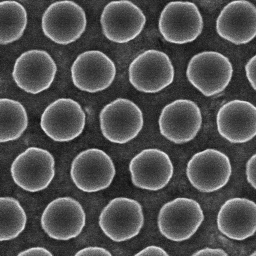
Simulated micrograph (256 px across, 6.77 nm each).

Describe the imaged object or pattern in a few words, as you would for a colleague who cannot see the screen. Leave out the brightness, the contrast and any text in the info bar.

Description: a regular array of raised bodies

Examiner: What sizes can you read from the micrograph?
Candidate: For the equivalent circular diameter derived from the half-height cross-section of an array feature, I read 281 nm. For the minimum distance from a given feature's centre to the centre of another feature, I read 384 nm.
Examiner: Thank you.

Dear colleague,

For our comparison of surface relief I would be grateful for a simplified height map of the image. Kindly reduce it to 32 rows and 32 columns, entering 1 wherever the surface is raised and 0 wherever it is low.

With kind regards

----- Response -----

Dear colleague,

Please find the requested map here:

11000001100000110000011100000110
11100011110001111100111110001111
11100111111001111100111110011111
11100011110001111100111110011111
11000011110001111000011110001111
00000000000000000000000000000000
00001000000100000011000000000000
00111100001111000111100011110001
00111110011111001111100011111001
00111110011111001111110011111001
00111100001111000111100011110001
00001000000000000000000001100000
10000001000000010000000000000000
11100011110001111000011110001111
11100111111001111100111110011111
11100111110001111100111110011111
11100011110001111000111100001111
10000000000000110000001000000110
00000000000000000000000000000000
00011100001110000111100011110000
00111110011111001111100011111001
00111110011111000111110111111001
00111100011111000111100011110001
00011000001110000011000001100000
00000000000000000000000000000000
11000011110000111000011110001111
11100011110001111100111110001111
11100111110001111100111110011111
11100011110001111000111110011111
11000001100000110000011100000110
00000000000000000000000000000000
00011100001110000011100001110000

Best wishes